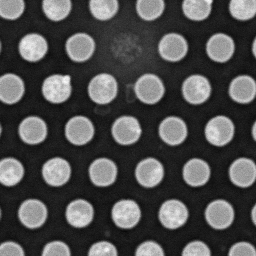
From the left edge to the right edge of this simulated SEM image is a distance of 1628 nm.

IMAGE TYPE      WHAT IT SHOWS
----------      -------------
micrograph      a regular array of raised bodies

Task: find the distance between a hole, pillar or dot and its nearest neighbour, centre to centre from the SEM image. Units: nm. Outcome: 296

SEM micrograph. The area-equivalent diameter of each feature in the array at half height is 181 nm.